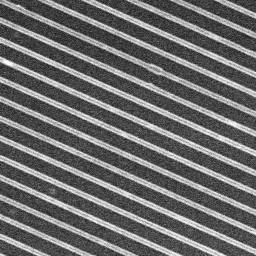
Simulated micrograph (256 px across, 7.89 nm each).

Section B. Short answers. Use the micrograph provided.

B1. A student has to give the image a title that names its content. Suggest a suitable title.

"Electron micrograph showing parallel lines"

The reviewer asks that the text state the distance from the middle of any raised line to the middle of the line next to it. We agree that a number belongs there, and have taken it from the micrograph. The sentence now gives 18 px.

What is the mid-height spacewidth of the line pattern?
111 nm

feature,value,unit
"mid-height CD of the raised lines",32.4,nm